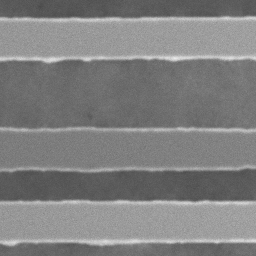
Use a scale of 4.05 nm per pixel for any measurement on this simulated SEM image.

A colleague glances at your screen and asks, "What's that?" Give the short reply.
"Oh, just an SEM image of lines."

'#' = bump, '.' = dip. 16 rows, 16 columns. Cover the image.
................
################
################
################
................
................
................
................
################
################
################
................
................
################
################
................